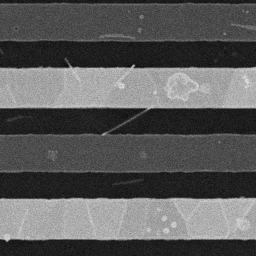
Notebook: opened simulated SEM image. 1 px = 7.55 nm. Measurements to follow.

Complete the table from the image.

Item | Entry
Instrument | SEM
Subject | lines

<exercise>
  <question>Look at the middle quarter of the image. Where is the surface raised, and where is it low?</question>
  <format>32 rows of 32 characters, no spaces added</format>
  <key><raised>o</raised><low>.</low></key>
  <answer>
................................
oooooooooooooooooooooooooooooooo
oooooooooooooooooooooooooooooooo
oooooooooooooooooooooooooooooooo
oooooooooooooooooooooooooooooooo
oooooooooooooooooooooooooooooooo
oooooooooooooooooooooooooooooooo
oooooooooooooooooooooooooooooooo
oooooooooooooooooooooooooooooooo
oooooooooooooooooooooooooooooooo
oooooooooooooooooooooooooooooooo
................................
................................
................................
................................
................................
................................
..........o.....................
oooooooooooooooooooooooooooooooo
oooooooooooooooooooooooooooooooo
oooooooooooooooooooooooooooooooo
oooooooooooooooooooooooooooooooo
oooooooooooooooooooooooooooooooo
oooooooooooooooooooooooooooooooo
oooooooooooooooooooooooooooooooo
oooooooooooooooooooooooooooooooo
oooooooooooooooooooooooooooooooo
................................
................................
................................
................................
................................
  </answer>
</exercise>